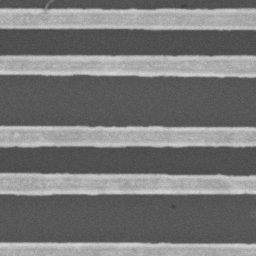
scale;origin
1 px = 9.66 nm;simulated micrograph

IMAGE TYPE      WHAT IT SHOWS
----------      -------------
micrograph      lines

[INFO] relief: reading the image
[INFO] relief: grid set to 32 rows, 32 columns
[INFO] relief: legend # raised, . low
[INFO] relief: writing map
................................
################################
################################
################################
................................
................................
................................
################################
################################
.......................#.#######
................................
................................
................................
................................
................................
................................
################################
################################
................................
................................
................................
................................
################################
################################
................................
................................
................................
................................
................................
................................
..####....####..................
################################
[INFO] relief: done